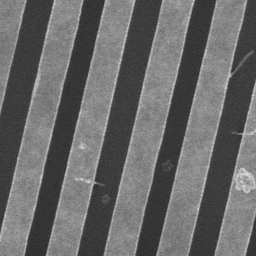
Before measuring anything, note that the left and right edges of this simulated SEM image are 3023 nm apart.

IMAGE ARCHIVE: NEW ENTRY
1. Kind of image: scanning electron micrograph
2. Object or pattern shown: lines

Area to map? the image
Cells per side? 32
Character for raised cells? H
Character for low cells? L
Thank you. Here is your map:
HHHLLLLHHHLLLHHHHLLLHHHHLLLHHHHL
HHHLLLHHHHLLLHHHHLLLHHHHLLLHHHHL
HHHLLLHHHHLLLHHHLLLLHHHHLLHHHHLL
HHLLLLHHHHLLHHHHLLLLHHHLLLHHHHLL
HHLLLLHHHLLLHHHHLLLHHHHLLLHHHHLL
HHLLLLHHHLLLHHHHLLLHHHHLLLHHHHLL
HHLLLHHHHLLLHHHLLLLHHHHLLLHHHLLL
HHLLLHHHHLLHHHHLLLLHHHHLLHHHHLLL
HLLLLHHHHLLHHHHLLLHHHHLLLHHHHLLL
HLLLLHHHLLLHHHHLLLHHHHLLLHHHHLLL
HLLLHHHHLLLHHHHLLLHHHHLLLHHHLLLL
HLLLHHHHLLLHHHLLLLHHHHLLHHHHLLLL
LLLLHHHHLLHHHHLLLHHHHLLLHHHHLLLH
LLLLHHHLLLHHHHLLLHHHHLLLHHHHLLLH
LLLHHHHLLLHHHHLLLHHHHLLLHHHHLLLH
LLLHHHHLLLHHHLLLLHHHHLLHHHHLLLLH
LLLHHHHLLHHHHLLLLHHHLLLHHHHLLLHH
LLLHHHLLLHHHHLLLHHHHLLLHHHHLLLHH
LLHHHHLLLHHHHLLLHHHHLLLHHHHLLLHH
LLHHHHLLLHHHLLLLHHHHLLHHHHLLLLHH
LLHHHHLLHHHHLLLLHHHLLLHHHHLLLHHH
LLHHHLLLHHHHLLLHHHHLLLHHHHLLLHHH
LLHHHLLLHHHHLLLHHHHLLLHHHHLLLHHH
LHHHHLLLHHHHLLLHHHHLLLHHHHLLLHHH
LHHHHLLLHHHLLLLHHHHLLHHHHLLLLHHH
LHHHHLLHHHHLLLHHHHLLLHHHHLLLHHHH
LHHHLLLHHHHLLLHHHHLLLHHHHLLLHHHH
HHHHLLLHHHHLLLHHHHLLLHHHHLLLHHHH
HHHHLLLHHHLLLLHHHHLLHHHHLLLLHHHH
HHHHLLHHHHLLLLHHHLLLHHHHLLLHHHHL
HHHLLLHHHHLLLHHHHLLLHHHHLLLHHHHL
HHHLLLHHHHLLLHHHHLLLHHHHLLLHHHHL